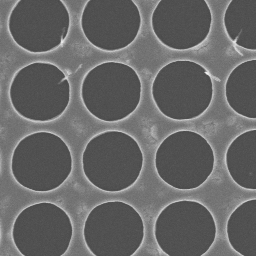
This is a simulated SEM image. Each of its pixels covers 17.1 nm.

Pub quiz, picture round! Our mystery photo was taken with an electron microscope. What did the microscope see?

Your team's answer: holes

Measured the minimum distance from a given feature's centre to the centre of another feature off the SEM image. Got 1.19 µm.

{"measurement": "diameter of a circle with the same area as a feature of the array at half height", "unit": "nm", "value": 1010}